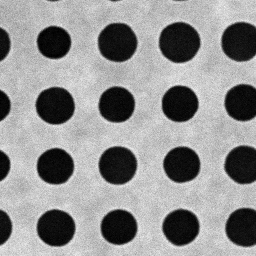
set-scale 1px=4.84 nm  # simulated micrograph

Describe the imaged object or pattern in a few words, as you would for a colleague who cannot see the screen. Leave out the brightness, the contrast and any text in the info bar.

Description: a regular array of holes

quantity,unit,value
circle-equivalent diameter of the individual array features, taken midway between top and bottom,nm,179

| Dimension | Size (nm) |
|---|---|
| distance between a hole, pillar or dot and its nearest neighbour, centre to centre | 297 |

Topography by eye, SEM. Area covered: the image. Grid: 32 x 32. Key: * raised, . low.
********************************
********************************
********************************
******..*****...*****...****....
.****....***.....***.....***....
.****....***.....***.....***....
.****...*****....***.....***....
**************..*****...*****..*
********************************
********************************
********************************
.****....****...*****...****....
.****....***.....***.....***....
.****....***.....***.....***....
.****....****...*****...*****...
******..************************
********************************
********************************
*******.******..******..*****...
.****....****....****....***....
.****....***.....***.....***....
.****....****....****....***....
*****...*****...*****...*****...
********************************
********************************
********************************
.*****..******..*****...*****...
.****....****....****....***....
..***....****....***.....***....
.****....****....****....***....
******..******.*******..*****...
********************************